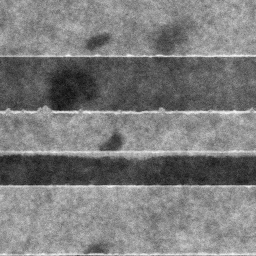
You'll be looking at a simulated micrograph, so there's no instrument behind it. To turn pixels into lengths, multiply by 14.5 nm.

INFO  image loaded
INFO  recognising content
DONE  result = lines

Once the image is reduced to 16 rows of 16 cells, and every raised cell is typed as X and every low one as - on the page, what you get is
XXXXXXXXXXXXXXXX
XXXXXXXXXXXXXXXX
XXXXXXXXXXXXXXXX
XXXXXXXXXXXXXXXX
----------------
----------------
----------------
XXXXXXXXXXXXXXXX
XXXXXXXXXXXXXXXX
XXXXXXXXXXXXXXXX
----------------
----------------
XXXXXXXXXXXXXXXX
XXXXXXXXXXXXXXXX
XXXXXXXXXXXXXXXX
XXXXXXXXXXXXXXXX